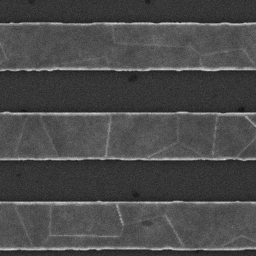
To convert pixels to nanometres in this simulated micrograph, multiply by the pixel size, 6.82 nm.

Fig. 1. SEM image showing lines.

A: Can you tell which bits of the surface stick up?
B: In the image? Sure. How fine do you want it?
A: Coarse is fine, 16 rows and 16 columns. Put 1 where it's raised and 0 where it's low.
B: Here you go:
0000000000000000
1111011111111111
1111111111111111
1111111111111111
0000000000000000
0000000000000000
0000000000000000
1111111111111111
1111111111111111
1111111111111111
0000000000000000
0000000000000000
0000000000000000
1111111111111111
1111111111111111
1111111111111111